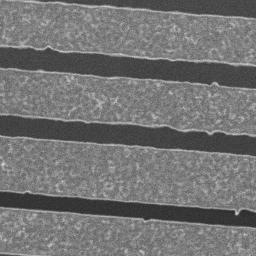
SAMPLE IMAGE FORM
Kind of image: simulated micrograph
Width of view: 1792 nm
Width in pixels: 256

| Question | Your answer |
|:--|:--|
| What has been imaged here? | one or a few lines or trenches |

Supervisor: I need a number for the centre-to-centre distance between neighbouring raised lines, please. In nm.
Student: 493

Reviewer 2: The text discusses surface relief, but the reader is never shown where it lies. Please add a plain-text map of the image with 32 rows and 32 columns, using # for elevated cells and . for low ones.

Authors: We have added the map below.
########........................
#####################...........
################################
################################
################################
################################
..........######################
.....................###########
................................
############....................
##########################......
################################
################################
################################
...#############################
................################
..........................#.####
######..........................
###################.............
################################
################################
################################
################################
################################
......##########################
....................############
#######.........................
##################.#............
################################
################################
################################
################################